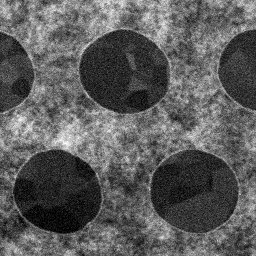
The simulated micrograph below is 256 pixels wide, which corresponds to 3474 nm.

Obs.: raised bodies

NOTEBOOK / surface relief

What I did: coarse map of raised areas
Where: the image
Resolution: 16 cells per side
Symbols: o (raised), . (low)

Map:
................
................
o.....oooo....oo
oo...ooooo....oo
oo...oooooo...oo
oo...oooooo...oo
o.....oooo.....o
................
................
...o.......oo...
.ooooo....oooo..
.ooooo...oooooo.
.ooooo...oooooo.
.ooooo....oooo..
...oo.......o...
................